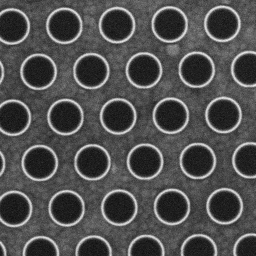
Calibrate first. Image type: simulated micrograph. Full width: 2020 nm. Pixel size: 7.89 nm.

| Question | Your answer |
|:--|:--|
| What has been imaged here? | an array of small figures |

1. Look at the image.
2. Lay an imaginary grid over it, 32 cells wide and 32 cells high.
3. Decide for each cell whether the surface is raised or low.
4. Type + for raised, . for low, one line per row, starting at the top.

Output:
................................
+++....++....+++....+++...+++...
++++..++++...++++..++++...++++..
++++..++++..+++++..++++...++++..
+++...++++...+++....+++...+++...
.+..............................
..............................++
...+++....+++...++++...+++...+++
...++++..+++++..++++..+++++..+++
...++++..+++++..++++..+++++..+++
...+++....+++....++....+++....++
................................
.+......+.....++....++.....++...
+++...++++...++++..++++...++++..
++++..++++...++++..+++++..++++..
++++..++++...++++..++++...++++..
+++....++.....++....++.....++...
................................
....++....+++....+++...+++....++
...++++..+++++..++++...++++..+++
+..++++..+++++..++++...++++..+++
...++++...+++...++++...+++....++
....++..........................
................................
+++....+++...++++...+++...++++..
++++..++++...++++..+++++..++++..
++++..++++...++++..+++++..++++..
+++....+++...+++....+++....++...
................................
..................+.....++....++
...++++...++++..++++...++++..+++
+..++++...++++..+++++..++++..+++